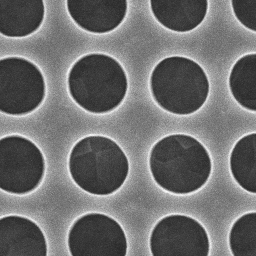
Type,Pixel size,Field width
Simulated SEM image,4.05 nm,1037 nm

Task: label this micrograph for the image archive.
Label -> holes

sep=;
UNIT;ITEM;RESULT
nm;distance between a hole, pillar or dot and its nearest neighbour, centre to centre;324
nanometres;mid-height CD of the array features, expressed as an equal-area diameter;239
